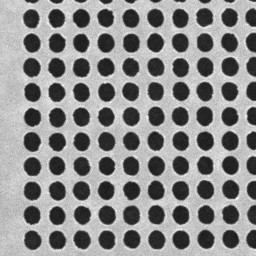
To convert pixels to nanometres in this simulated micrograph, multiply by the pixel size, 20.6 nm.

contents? a regular array of holes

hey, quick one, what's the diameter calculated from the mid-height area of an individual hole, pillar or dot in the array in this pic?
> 377 nm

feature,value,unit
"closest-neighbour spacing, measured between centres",500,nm